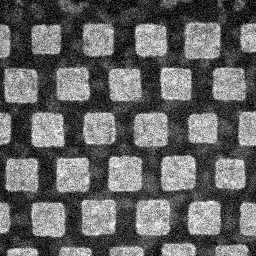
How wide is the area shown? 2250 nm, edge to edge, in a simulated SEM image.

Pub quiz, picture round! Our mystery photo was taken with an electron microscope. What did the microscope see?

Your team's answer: a regular array of raised bodies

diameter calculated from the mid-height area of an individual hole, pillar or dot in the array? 0.3 microns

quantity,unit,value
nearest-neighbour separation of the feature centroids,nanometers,448